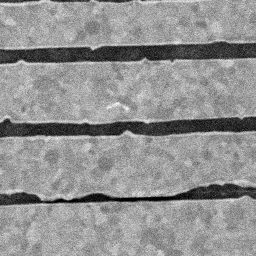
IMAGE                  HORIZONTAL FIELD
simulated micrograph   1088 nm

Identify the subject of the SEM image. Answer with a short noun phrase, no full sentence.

one or a few lines or trenches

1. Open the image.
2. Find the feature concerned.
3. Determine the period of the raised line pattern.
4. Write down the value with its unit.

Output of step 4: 301 nm